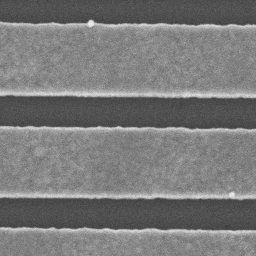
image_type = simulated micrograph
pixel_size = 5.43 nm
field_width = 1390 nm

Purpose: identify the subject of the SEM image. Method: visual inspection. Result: lines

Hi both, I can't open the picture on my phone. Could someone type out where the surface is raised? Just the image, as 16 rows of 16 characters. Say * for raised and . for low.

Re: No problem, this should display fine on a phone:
................
*******.***.....
****************
****************
****************
****************
................
................
****************
****************
****************
****************
................
................
****************
****************